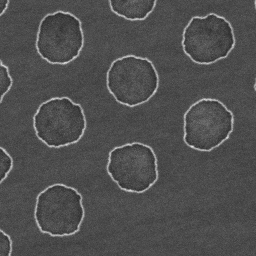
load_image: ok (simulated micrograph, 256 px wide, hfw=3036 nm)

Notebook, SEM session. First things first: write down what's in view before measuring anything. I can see holes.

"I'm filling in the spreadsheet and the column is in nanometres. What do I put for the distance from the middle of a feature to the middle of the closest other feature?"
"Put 1010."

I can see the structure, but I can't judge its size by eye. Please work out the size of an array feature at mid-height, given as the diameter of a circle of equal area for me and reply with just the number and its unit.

581 nanometres